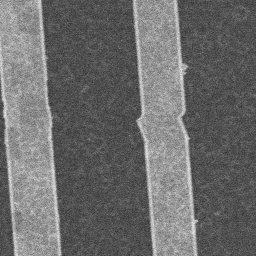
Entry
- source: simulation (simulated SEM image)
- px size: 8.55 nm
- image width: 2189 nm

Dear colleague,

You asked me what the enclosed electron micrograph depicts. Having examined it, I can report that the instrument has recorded one or a few lines or trenches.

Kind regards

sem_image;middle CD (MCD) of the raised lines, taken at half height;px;41.4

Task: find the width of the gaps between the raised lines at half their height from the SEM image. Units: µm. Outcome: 0.808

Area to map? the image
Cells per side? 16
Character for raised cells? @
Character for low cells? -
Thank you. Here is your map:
@@------@@@-----
@@@------@@-----
@@@------@@-----
@@@------@@-----
@@@------@@-----
@@@------@@-----
@@@------@@-----
@@@------@@-----
@@@------@@@----
@@@------@@@----
-@@------@@@----
-@@------@@@----
-@@------@@@----
-@@@-----@@@----
-@@@------@@----
-@@@------@@----